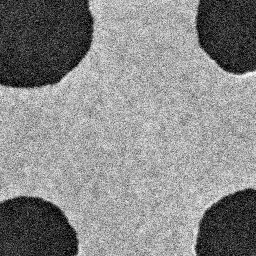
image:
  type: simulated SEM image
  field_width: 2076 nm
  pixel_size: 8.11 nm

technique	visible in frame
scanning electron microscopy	holes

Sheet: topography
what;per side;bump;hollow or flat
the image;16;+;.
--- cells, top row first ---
......++++++....
......++++++....
......++++++....
.....++++++++...
....++++++++++..
+.++++++++++++++
++++++++++++++++
++++++++++++++++
++++++++++++++++
++++++++++++++++
++++++++++++++++
++++++++++++++++
...+++++++++++..
....+++++++++...
.....+++++++....
.....+++++++....